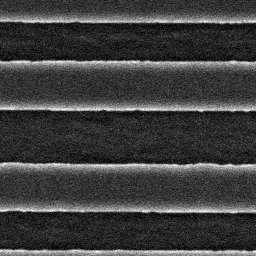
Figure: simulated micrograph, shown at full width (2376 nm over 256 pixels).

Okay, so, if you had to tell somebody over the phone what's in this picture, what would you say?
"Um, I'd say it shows lines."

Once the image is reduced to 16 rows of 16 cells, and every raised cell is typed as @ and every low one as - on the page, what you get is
@@@@@@@@@@@@@@@@
----------------
----------------
----------------
@@@@@@@@@@@@@@@@
@@@@@@@@@@@@@@@@
@@@@@@@@@@@@@@@@
----------------
----------------
----------------
@@@@@@@@@@@@@@@@
@@@@@@@@@@@@@@@@
@@@@@@@@@@@@@@@@
----------------
----------------
----------------